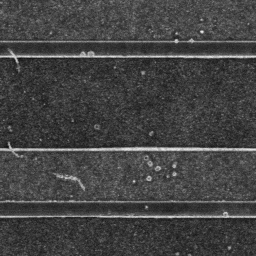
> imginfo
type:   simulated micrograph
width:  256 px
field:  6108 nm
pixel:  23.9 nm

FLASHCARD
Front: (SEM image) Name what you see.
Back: lines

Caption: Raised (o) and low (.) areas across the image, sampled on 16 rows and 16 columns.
oooooooooooooooo
oooooooooooooooo
oooooooooooooooo
oo...o.o.ooooo.o
................
................
................
................
................
oooooooooooooooo
oooooooooooooooo
oooooooooooooooo
oooooooooooooooo
oooooooooooooooo
................
................